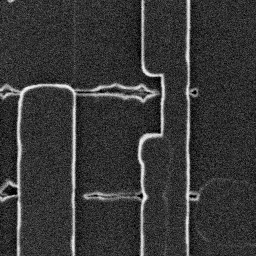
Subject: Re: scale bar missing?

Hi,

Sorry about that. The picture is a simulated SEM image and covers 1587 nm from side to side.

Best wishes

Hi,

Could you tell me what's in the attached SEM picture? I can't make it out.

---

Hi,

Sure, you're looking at wiring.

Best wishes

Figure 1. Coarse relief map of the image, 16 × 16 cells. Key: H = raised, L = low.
LLLLLLLLLHHHLLLL
LLLLLLLLLHHHLLLL
LLLLLLLLLHHHLLLL
LLLLLLLLLHHHLLLL
LLLLLLLLLHHHLLLL
LLHHLLLLLLHHLLLL
LHHHHLLLLLHHLLLL
LHHHHLLLLLHHLLLL
LHHHHLLLLHHHLLLL
LHHHHLLLLHHHLLLL
LHHHHLLLLHHHLLLL
LHHHHLLLLHHHLLLL
LHHHHLLLLHHHLLLL
LHHHHLLLLHHHLLLL
LHHHHLLLLHHHLLLL
LHHHHLLLLHHHLLLL